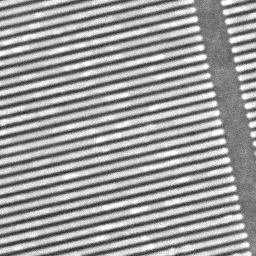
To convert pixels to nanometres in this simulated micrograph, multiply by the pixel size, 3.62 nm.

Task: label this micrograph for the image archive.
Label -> parallel lines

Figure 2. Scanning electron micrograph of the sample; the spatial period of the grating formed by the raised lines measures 34.9 nanometres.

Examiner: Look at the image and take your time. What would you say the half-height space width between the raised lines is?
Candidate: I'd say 19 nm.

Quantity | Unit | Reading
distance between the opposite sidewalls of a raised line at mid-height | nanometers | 15.9